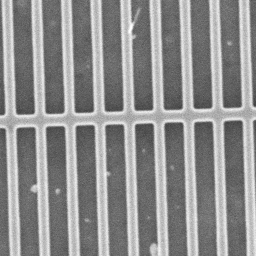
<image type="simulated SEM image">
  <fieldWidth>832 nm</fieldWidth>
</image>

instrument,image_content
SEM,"groups of lines, slits or small figures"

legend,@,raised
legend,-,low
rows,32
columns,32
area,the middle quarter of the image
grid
@@-----@@@-----@@-----@@------@@
@@-----@@@-----@@-----@@------@@
@@-----@@@-----@@-----@@------@@
@@-----@@@-----@@-----@@------@@
@@-----@@@-----@@-----@@------@@
@@------@@-----@@-----@@------@@
@@------@@-----@@-----@@@-----@@
@@------@@-----@@------@@-----@@
@@------@@-----@@------@@-----@@
@@------@@-----@@------@@-----@@
@@------@@-----@@------@@-----@@
@@------@@-----@@@----@@@----@@@
@@@@@@@@@@@@@@@@@@@@@@@@@@@@@@@@
@@@@@@@@@@@@@@@@@@@@@@@@@@@@@@@@
@@@@@@@@@@@@@@@@@@@@@@@@@@---@@@
@@@-----@@-----@@@-----@@-----@@
-@@-----@@-----@@@-----@@-----@@
-@@-----@@-----@@@-----@@-----@@
-@@-----@@-----@@@-----@@-----@@
-@@-----@@-----@@@-----@@-----@@
-@@-----@@-----@@@-----@@-----@@
-@@-----@@-----@@@-----@@-----@@
-@@-----@@-----@@@-----@@-----@@
-@@-----@@------@@-----@@-----@@
-@@-----@@------@@-----@@-----@@
-@@-----@@------@@-----@@------@
-@@-----@@------@@-----@@------@
-@@-----@@------@@-----@@------@
-@@-----@@------@@-----@@------@
-@@-----@@------@@-----@@------@
-@@-----@@------@@-----@@------@
-@@-----@@------@@-----@@------@